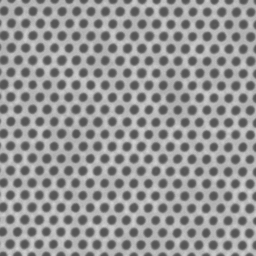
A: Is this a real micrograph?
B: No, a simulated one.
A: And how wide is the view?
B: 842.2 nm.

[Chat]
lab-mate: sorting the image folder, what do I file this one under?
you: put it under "a regular array of holes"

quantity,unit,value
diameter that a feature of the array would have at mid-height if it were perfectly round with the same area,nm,30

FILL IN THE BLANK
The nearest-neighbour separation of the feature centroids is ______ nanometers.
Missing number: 46.1